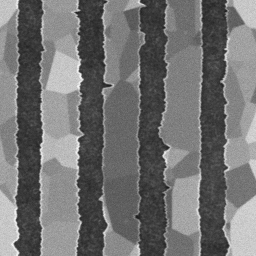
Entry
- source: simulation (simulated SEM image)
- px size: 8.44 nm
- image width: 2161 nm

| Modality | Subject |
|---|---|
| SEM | one or a few lines or trenches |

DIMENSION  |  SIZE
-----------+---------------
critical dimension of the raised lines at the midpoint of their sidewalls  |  304 nm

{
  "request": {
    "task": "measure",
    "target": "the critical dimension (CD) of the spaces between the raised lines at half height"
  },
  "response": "214 nm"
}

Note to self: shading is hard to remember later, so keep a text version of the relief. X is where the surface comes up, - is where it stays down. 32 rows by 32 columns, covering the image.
XX---XXXXX---XXXXX---XXXX---XXXX
XX---XXXXX---XXXX----XXXX---XXXX
XX---XXXXX---XXXXX---XXXX---XXXX
XX---XXXXX---XXXXX---XXXX---XXXX
XX---XXXXX---XXXXX---XXXX---XXXX
XX---XXXXX---XXXXX---XXXX---XXXX
XX---XXXXX---XXXX----XXXX---XXXX
XX---XXXXX---XXXX----XXXX---XXXX
XX---XXXXX---XXXX----XXXX---XXXX
XX---XXXXX---XXXX----XXXX---XXXX
XX---XXXXX---XXXX----XXXX---XXXX
XX---XXXXX---XXXXX---XXXX---XXXX
XX---XXXXX---XXXX----XXXX---XXXX
XX---XXXXX---XXXX----XXXX---XXXX
XX---XXXXX---XXXX---XXXXX---XXXX
XX---XXXXX---XXXX---XXXXX---XXXX
XX---XXXXX---XXXX---XXXXX---XXXX
XX---XXXXX---XXXX---XXXXX---XXXX
XX---XXXXX---XXXX----XXXX---XXXX
XX---XXXXX---XXXX----XXXX---XXXX
XX---XXXXX---XXXX----XXXX---XXXX
XX---XXXXX---XXXX---XXXXX---XXXX
XX---XXXXX---XXXX----XXXX---XXXX
XX---XXXXX---XXXX----XXXX---XXXX
XX---XXXXX---XXXX----XXXX---XXXX
XX---XXXXX---XXXX----XXXX---XXXX
XX---XXXXX---XXXX----XXXX---XXXX
XX---XXXXX---XXXX----XXXX---XXXX
XX---XXXXX---XXXX----XXXX---XXXX
XX---XXXXX---XXXX----XXXX---XXXX
XX---XXXXX---XXXX----XXXX----XXX
XX---XXXXX---XXXX----XXXX---XXXX